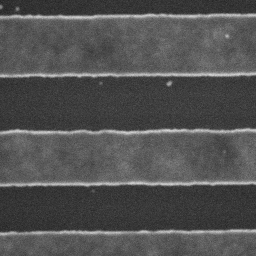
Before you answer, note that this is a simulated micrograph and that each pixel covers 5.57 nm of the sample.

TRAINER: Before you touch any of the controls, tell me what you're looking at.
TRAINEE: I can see lines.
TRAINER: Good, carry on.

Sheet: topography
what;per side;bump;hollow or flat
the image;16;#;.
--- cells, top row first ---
................
################
################
################
################
................
................
................
################
################
################
########.###.#..
................
................
...##...########
################